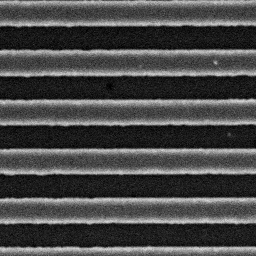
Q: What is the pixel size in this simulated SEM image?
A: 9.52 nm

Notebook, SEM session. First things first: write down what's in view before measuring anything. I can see lines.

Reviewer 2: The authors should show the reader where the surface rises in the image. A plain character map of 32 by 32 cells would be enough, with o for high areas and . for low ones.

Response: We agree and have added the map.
oooooooooooooooooooooooooooooooo
oooooooooooooooooooooooooooooooo
oooooooooooooooooooooooooooooooo
................................
................................
................................
oooooooooooooooooooooooooooooooo
oooooooooooooooooooooooooooooooo
oooooooooooooooooooooooooooooooo
...o............................
................................
................................
.............................o.o
oooooooooooooooooooooooooooooooo
oooooooooooooooooooooooooooooooo
oooooooooooooooooooooooooooooo..
................................
................................
................................
oooooooooooooooooooooooooooooooo
oooooooooooooooooooooooooooooooo
oooooooooooooooooooooooooooooooo
................................
................................
................................
oooooooooooooooooooooooooooooooo
oooooooooooooooooooooooooooooooo
oooooooooooooooooooooooooooooooo
................................
................................
................................
oooooooooooooooooooooooooooooooo